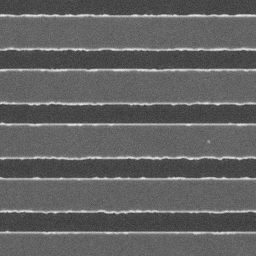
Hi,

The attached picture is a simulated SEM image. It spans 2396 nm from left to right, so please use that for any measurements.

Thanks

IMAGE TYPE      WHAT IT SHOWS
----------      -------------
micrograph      lines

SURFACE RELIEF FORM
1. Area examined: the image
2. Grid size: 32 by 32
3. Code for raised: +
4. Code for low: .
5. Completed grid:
................................
................................
++++++++++++++++++++++++++++++++
++++++++++++++++++++++++++++++++
++++++++++++++++++++++++++++++++
++++++++++++++++++++++++++++++++
................................
................................
................................
++++++++++++++++++++++++++++++++
++++++++++++++++++++++++++++++++
++++++++++++++++++++++++++++++++
++++++++++++++++++++++++++++++++
................................
................................
+...........................+...
++++++++++++++++++++++++++++++++
++++++++++++++++++++++++++++++++
++++++++++++++++++++++++++++++++
++++++++++++++++++++++++++++++++
................................
................................
++++++++++++++++++++++++++++++++
++++++++++++++++++++++++++++++++
++++++++++++++++++++++++++++++++
++++++++++++++++++++++++++++++++
.....+++.....+++.......++.++....
................................
................................
++++++++++++++++++++++++++++++++
++++++++++++++++++++++++++++++++
++++++++++++++++++++++++++++++++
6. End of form